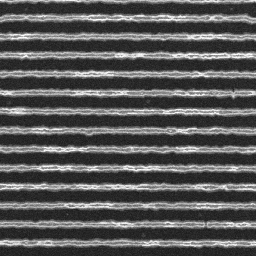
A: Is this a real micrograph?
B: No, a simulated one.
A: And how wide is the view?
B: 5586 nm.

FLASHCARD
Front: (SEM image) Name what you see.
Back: parallel lines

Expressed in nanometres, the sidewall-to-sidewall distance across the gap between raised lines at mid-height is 292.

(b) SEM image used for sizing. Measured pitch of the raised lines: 410 nm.